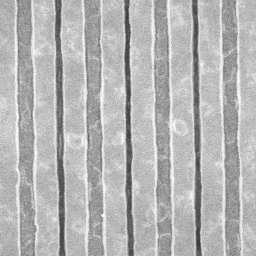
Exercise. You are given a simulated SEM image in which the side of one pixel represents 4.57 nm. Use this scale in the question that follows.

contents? parallel lines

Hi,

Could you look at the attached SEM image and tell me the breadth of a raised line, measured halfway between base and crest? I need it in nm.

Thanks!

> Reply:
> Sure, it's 107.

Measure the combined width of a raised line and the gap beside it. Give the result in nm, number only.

152